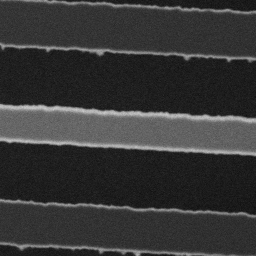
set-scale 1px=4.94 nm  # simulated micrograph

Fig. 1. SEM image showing lines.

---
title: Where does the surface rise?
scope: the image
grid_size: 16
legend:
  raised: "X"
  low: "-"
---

XXXXXXXXXXX-----
XXXXXXXXXXXXXXXX
XXXXXXXXXXXXXXXX
-----------XXXXX
----------------
----------------
----------------
XXXXXXXXXXXXXXXX
XXXXXXXXXXXXXXXX
------------XXXX
----------------
----------------
----------------
XXXXXXXXXXXXXXXX
XXXXXXXXXXXXXXXX
----XXXXXXXXXXXX